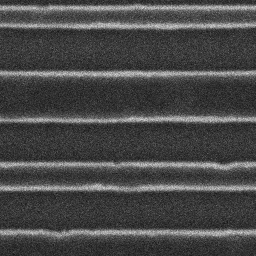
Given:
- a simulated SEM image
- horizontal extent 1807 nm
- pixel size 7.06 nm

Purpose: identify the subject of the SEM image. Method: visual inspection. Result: one or a few lines or trenches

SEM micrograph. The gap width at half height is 305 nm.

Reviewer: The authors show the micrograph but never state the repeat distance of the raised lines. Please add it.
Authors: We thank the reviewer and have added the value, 563 nanometres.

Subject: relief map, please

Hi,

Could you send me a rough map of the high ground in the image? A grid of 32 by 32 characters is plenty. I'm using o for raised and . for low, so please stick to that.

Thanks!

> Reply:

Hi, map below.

................................
oooooooooooooooooooooooooooooooo
oooooooooooooooooooooooooooooooo
................................
................................
................................
................................
................................
................................
oooooooooooooooooooooooooooooooo
oooooooooooooooooooooooooooooooo
oooooooooooooooooooooooooooooooo
oooooooooooooooooooooooooooooooo
oooooooooooooooooooooooooooooooo
oooooooooooooooooooooooooooooooo
................................
................................
................................
................................
................................
.......ooooooooooooooo.oooo..ooo
oooooooooooooooooooooooooooooooo
oooooooooooooooooooooooooooooooo
oooooooooooooooooooooooooooooooo
................................
................................
................................
................................
................................
oooooooooooooooooooooooooooooooo
oooooooooooooooooooooooooooooooo
oooooooooooooooooooooooooooooooo